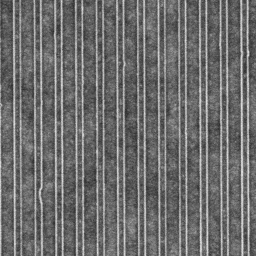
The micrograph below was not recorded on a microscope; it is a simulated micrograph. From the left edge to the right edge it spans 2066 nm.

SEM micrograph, parallel lines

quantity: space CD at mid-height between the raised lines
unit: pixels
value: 13.6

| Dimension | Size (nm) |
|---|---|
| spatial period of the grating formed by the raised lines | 167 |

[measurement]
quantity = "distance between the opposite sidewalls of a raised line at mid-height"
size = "55.5 nm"